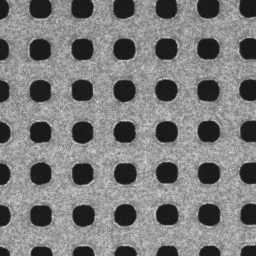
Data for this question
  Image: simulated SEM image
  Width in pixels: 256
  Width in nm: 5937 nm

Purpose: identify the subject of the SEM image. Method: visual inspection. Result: a regular array of holes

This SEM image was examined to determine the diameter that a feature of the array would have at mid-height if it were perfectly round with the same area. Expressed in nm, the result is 538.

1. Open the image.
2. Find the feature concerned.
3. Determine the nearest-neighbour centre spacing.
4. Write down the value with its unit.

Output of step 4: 959 nm